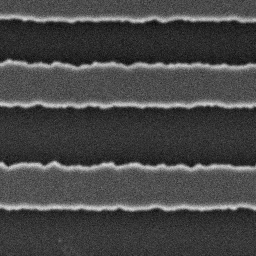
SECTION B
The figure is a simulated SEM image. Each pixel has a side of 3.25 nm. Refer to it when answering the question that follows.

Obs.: lines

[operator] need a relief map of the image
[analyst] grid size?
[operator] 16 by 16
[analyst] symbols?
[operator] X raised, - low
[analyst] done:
XXXXXXXXXXXXXXXX
----------------
----------------
----------------
XXXXXXXXXXXXXXXX
XXXXXXXXXXXXXXXX
XXXXXXXXXXXXXXXX
----------------
----------------
----------------
XXXXXXXXXXXXXXXX
XXXXXXXXXXXXXXXX
XXXXXXXXXXXXXXXX
----------------
----------------
----------------